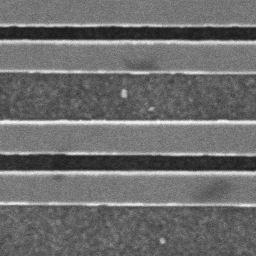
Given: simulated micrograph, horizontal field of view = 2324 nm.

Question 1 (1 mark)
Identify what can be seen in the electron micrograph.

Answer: lines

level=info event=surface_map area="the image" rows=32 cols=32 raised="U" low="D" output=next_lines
UUUUUUUUUUUUUUUUUUUUUUUUUUUUUUUU
UUUUUUUUUUUUUUUUUUUUUUUUUUUUUUUU
UUUUUUUUUUUUUUUUUUUUUUUUUUUUUUUU
DDDDDDDDDDDDDDDDDDDDDDDDDDDDDDDD
DDDDDDDDDDDDDDDDDDDDDDDDDDDDDDDD
UUUUUUUUUUUUUUUUUUUUUUUUUUUUUUUU
UUUUUUUUUUUUUUUUUUUUUUUUUUUUUUUU
UUUUUUUUUUUUUUUUUUUUUUUUUUUUUUUU
UUUUUUUUUUUUUUUUUUUUUUUUUUUUUUUU
DDDDDDDDDDDDDDDDDDDDDDDDDDDDDDDD
DDDDDDDDDDDDDDDDDDDDDDDDDDDDDDDD
DDDDDDDDDDDDDDDDDDDDDDDDDDDDDDDD
DDDDDDDDDDDDDDDDDDDDDDDDDDDDDDDD
DDDDDDDDDDDDDDDDDDDDDDDDDDDDDDDD
DDDDDDDDDDDDDDDDDDDDDDDDDDDDDDDD
UUUUUUUUUUUUUUUUUUUUUUUUUUUUUUUU
UUUUUUUUUUUUUUUUUUUUUUUUUUUUUUUU
UUUUUUUUUUUUUUUUUUUUUUUUUUUUUUUU
UUUUUUUUUUUUUUUUUUUUUUUUUUUUUUUU
DDDDDDDDDDDDDDDDDDDDDDDDDDDDDDUU
DDDDDDDDDDDDDDDDDDDDDDDDDDDDDDDD
UUUUUUUUUUUUUUUUUUUUUUUUUUUUUUUU
UUUUUUUUUUUUUUUUUUUUUUUUUUUUUUUU
UUUUUUUUUUUUUUUUUUUUUUUUUUUUUUUU
UUUUUUUUUUUUUUUUUUUUUUUUUUUUUUUU
UUUUUUUUUUUUUUUUUUUUUUUUUUUUUUUU
DDDDDDDDDDDDDDDDDDDDDDDDDDDDDDDD
DDDDDDDDDDDDDDDDDDDDDDDDDDDDDDDD
DDDDDDDDDDDDDDDDDDDDDDDDDDDDDDDD
DDDDDDDDDDDDDDDDDDDDDDDDDDDDDDDD
DDDDDDDDDDDDDDDDDDDDDDDDDDDDDDDD
DDDDDDDDDDDDDDDDDDDDDDDDDDDDDDDD